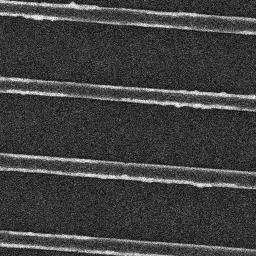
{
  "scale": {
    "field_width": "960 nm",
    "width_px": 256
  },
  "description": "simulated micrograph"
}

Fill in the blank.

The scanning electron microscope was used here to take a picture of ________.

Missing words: one or a few lines or trenches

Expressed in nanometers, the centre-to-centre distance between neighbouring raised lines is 288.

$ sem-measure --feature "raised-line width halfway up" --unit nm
58.4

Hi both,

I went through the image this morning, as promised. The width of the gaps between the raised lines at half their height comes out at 230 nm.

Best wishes